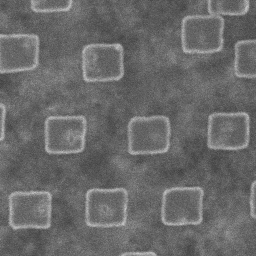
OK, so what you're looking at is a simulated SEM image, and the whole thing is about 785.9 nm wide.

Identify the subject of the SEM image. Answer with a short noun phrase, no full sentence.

raised bodies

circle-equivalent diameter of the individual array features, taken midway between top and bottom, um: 0.13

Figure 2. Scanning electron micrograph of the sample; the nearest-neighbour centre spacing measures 240 nm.